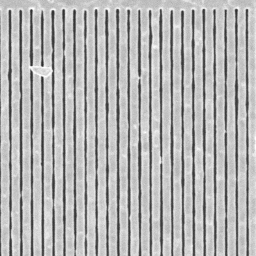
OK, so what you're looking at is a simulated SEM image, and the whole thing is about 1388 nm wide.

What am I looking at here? parallel lines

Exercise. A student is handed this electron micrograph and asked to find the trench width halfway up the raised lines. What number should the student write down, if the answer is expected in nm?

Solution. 14.9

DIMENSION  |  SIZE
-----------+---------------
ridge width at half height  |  43.3 nm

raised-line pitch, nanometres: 58.4